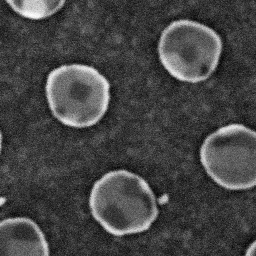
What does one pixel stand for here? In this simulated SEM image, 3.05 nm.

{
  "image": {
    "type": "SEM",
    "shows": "raised bodies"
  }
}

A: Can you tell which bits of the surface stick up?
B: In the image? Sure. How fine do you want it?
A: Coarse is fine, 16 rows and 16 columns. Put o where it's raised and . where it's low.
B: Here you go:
.ooo............
...........o....
..........oooo..
..........oooo..
...ooo.....oo...
...oooo.........
...oooo.........
....oo..........
.............ooo
.............ooo
.............ooo
......ooo.....oo
......oooo......
......oooo......
ooo....o........
ooo.............